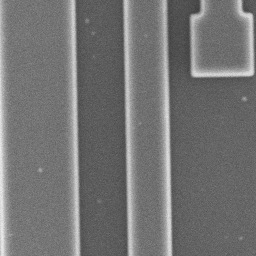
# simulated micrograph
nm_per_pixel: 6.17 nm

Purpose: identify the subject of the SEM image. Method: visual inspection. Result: groups of lines, slits or small figures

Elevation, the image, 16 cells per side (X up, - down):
XXXXX---XX---XX-
XXXXX---XX--XXXX
XXXXX---XX--XXXX
XXXXX---XX--XXXX
XXXXX---XX--XXXX
XXXXX---XX------
XXXXX---XX------
XXXXX---XX------
XXXXX---XX------
XXXXX---XX------
XXXXX---XXX-----
XXXXX---XXX-----
XXXXX---XXX-----
XXXXX---XXX-----
XXXXX---XXX-----
XXXXX---XXX-----